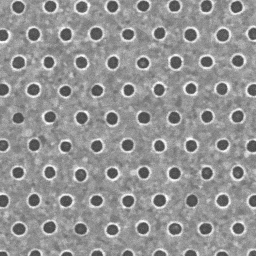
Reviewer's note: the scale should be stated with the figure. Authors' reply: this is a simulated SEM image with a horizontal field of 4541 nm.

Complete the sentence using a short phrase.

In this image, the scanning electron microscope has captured a regular array of holes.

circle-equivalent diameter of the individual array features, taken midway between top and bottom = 224 nanometres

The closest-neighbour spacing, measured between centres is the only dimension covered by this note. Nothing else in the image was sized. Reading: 544 nanometres